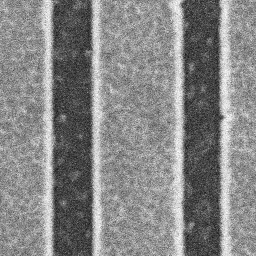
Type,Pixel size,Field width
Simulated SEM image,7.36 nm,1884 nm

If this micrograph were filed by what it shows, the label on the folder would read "one or a few lines or trenches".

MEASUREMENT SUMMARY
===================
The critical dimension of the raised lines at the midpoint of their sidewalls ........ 81.5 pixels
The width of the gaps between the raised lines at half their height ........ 48.9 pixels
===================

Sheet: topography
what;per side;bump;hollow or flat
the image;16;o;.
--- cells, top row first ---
ooo...ooooo...oo
ooo...ooooo...oo
ooo...ooooo...oo
ooo...ooooo...oo
ooo...ooooo...oo
ooo...ooooo...oo
ooo...ooooo...oo
ooo...ooooo...oo
ooo...ooooo...oo
ooo...ooooo...oo
ooo...ooooo...oo
ooo...ooooo...oo
ooo...ooooo...oo
ooo...ooooo...oo
ooo...ooooo...oo
ooo...ooooo...oo